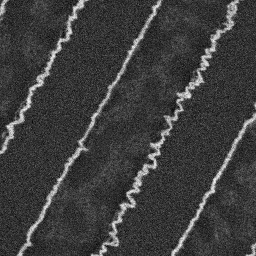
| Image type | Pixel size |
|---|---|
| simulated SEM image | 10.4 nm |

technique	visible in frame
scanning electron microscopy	one or a few lines or trenches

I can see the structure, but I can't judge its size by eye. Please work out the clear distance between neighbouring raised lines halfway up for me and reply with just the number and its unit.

688 nm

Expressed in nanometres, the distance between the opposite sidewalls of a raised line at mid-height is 717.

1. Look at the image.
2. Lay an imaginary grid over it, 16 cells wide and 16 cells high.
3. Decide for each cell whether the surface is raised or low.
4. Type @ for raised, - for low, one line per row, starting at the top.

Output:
-----@@@@@-----@
----@@@@@-----@@
----@@@@@----@@@
---@@@@@-----@@@
---@@@@@----@@@@
--@@@@@-----@@@@
--@@@@-----@@@@@
-@@@@@-----@@@@@
@@@@@-----@@@@@-
@@@@@-----@@@@@-
@@@@-----@@@@@--
@@@@----@@@@@---
@@@-----@@@@@---
@@@----@@@@@----
@@-----@@@@@----
@@----@@@@@-----